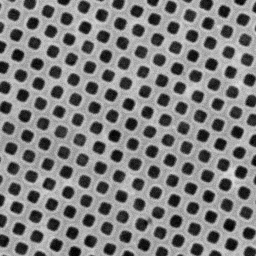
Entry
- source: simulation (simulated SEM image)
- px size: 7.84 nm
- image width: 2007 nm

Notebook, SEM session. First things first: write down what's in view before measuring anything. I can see a regular array of holes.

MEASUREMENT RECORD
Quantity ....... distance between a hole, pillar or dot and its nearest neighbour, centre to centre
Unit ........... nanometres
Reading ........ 154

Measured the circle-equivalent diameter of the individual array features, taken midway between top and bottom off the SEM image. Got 105 nanometers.